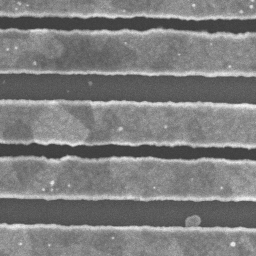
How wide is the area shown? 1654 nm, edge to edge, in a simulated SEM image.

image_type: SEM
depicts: lines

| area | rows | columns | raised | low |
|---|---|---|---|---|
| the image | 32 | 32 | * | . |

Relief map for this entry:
********************************
********************************
................................
................................
********************************
********************************
********************************
********************************
********************************
..........................*.....
................................
................................
***....*........................
********************************
********************************
********************************
********************************
********************************
...............................*
........*.......................
********************************
********************************
********************************
********************************
********************************
................................
................................
................................
*******************************.
********************************
********************************
********************************